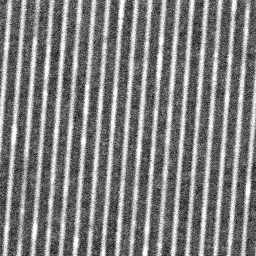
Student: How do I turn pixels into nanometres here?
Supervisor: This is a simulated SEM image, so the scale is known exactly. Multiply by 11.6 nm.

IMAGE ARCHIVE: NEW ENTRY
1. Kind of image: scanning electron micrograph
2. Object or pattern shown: parallel lines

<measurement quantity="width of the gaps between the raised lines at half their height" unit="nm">128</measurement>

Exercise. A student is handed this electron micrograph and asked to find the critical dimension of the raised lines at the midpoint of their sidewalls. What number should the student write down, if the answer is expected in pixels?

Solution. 2.49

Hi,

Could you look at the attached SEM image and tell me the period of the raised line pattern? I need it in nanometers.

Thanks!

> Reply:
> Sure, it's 163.